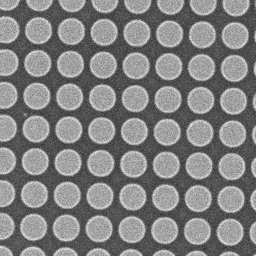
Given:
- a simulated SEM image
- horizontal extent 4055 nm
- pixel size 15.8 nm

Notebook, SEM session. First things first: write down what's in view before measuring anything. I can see an array of small figures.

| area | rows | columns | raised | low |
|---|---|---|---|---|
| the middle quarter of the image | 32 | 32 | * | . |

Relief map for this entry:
*****..******..******..******..*
*****..******..******..******..*
****....****...*****....*****...
.................**......***....
................................
***......**.....................
****...*****....****....****....
****...******..******..******..*
****..*******..******..******..*
****...******..******..******..*
****...*****...*****...******..*
.........*......***.....****....
................................
**..............................
****...*****...*****....****....
****..******...*****...******..*
****..*******..******..******..*
****..******...******..******..*
****...*****...*****...******..*
**......***.....***.....****....
................................
................................
***....****....****.....***.....
****..******...*****...*****...*
****..******..*******..******..*
****..******..*******.*******..*
****..******...*****...******..*
**.....****....****....*****...*
................................
................................
***....****.....***.....***.....
****..******...*****...*****...*